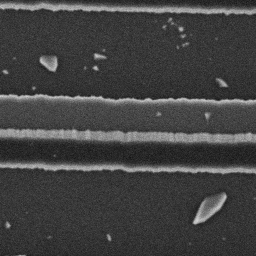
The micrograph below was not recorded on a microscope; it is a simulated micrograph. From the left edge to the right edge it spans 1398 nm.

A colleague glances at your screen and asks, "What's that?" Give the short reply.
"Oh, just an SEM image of lines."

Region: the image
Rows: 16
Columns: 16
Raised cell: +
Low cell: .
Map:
...+++++++++++++
................
................
................
................
................
++++++++++++++++
++++++++++++++++
++++++++++++++++
++++++++++++++++
...+++.+++++++++
................
................
................
................
................